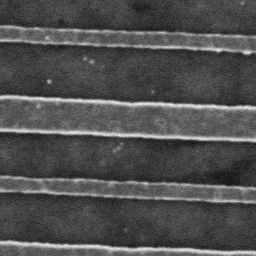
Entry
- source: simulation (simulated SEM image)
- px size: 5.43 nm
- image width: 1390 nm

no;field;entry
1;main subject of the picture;lines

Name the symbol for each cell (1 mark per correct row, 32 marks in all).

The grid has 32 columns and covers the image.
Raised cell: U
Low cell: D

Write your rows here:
DDDDDDDDDDDDDDDDDDDDDDDDDDDDDDDD
DDDDDDDDDDDDDDDDDDDDDDDDDDDDDDDD
DDDDDDDDDDDDDDDDDDDDDDDDDDDDDDDD
UUUDDDDDDDDDDDDDDDDDDDDDDDDDDDDD
UUUUUUUUUUUUUUUUUUUUUUUUUUUUUUUD
DDDDDDDDDUUUUUUUUUUUUUUUUUUUUUUU
DDDDDDDDDDDDDDDDDDDDDDDDDDDDDDUU
DDDDDDDDDDDDDDDDDDDDDDDDDDDDDDDD
DDDDDDDDDDDDDDDDDDDDDDDDDDDDDDDD
DDDDDDDDDDDDDDDDDDDDDDDDDDDDDDDD
DDDDDDDDDDDDDDDDDDDDDDDDDDDDDDDD
DDDDDDDDDDDDDDDDDDDDDDDDDDDDDDDD
UUUUUUUUUDDDDDDDDDDDDDDDDDDDDDDD
UUUUUUUUUUUUUUUUUUUUUUUUUUUUUUUU
UUUUUUUUUUUUUUUUUUUUUUUUUUUUUUUU
UUUUUUUUUUUUUUUUUUUUUUUUUUUUUUUU
DDDUUUUUUUUUUUUUUUUUUUUUUUUUUUUU
DDDDDDDDDDDDDDDDDDDDDDDDDDDDDDUU
DDDDDDDDDDDDDDDDDDDDDDDDDDDDDDDD
DDDDDDDDDDDDDDDDDDDDDDDDDDDDDDDD
DDDDDDDDDDDDDDDDDDDDDDDDDDDDDDDD
DDDDDDDDDDDDDDDDDDDDDDDDDDDDDDDD
UUUUUUUUUUUDDDDDDDDDDDDDDDDDDDDD
UUUUUUUUUUUUUUUUUUUUUUUUUUUUUUUU
DDDDDDDDDDDDDUUUUUUUUUUUUUUUUUUU
DDDDDDDDDDDDDDDDDDDDDDDDDDDDDDDD
DDDDDDDDDDDDDDDDDDDDDDDDDDDDDDDD
DDDDDDDDDDDDDDDDDDDDDDDDDDDDDDDD
DDDDDDDDDDDDDDDDDDDDDDDDDDDDDDDD
DDDDDDDDDDDDDDDDDDDDDDDDDDDDDDDD
UUUUUUDDDDDDDDDDDDDDDDDDDDDDDDDD
UUUUUUUUUUUUUUUUUUUUUUUUUUUUDUUD